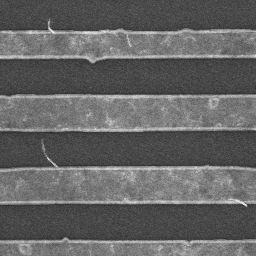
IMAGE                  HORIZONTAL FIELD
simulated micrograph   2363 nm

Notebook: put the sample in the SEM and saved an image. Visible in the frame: one or a few lines or trenches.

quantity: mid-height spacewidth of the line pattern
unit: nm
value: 366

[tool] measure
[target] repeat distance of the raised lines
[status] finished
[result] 70.4 pixels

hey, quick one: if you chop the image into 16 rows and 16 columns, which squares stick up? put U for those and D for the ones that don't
DDDDDDDDDDDDDDDD
DDDDDDDDDDDDDDDD
UUUUUUUUUUUUUUUU
UUUUUUUUUUUUUUUU
DDDDDDDDDDDDDDDD
DDDDDDDDDDDDDDDD
UUUUUUUUUUUUUUUU
UUUUUUUUUUUUUUUU
DDDDDDDDDDDDDDDD
DDDDDDDDDDDDDDDD
DDDDDDDDDDDDDDDD
UUUUUUUUUUUUUUUU
UUUUUUUUUUUUUUUU
DDDDDDDDDDDDDDDD
DDDDDDDDDDDDDDDD
UUUUUUUUUUUUUUUU